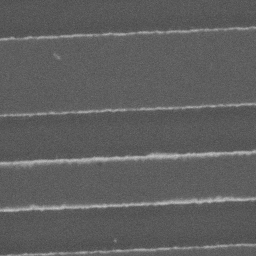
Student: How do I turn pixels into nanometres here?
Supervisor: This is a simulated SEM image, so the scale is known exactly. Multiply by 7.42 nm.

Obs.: lines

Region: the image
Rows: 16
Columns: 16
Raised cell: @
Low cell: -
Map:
----------------
----------------
@@@@@@@@@@@@@@@@
@@@@@@@@@@@@@@@@
@@@@@@@@@@@@@@@@
@@@@@@@@@@@@@@@@
@@@@@@@@@@@@@@@@
----------------
----------------
--------------@@
@@@@@@@@@@@@@@@@
@@@@@@@@@@@@@@@@
@@@@@@@@@@@@@@@@
----------------
----------------
----------@@@@@@